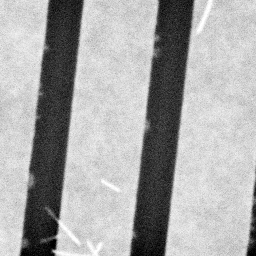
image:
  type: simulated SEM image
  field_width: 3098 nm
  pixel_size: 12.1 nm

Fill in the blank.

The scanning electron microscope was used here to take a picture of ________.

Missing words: lines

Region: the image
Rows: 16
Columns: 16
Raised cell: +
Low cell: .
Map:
+++..+++++..++++
+++..+++++..++++
+++..+++++..++++
+++..+++++..++++
+++..++++...++++
++...++++...++++
++...++++..+++++
++..+++++..+++++
++..+++++..+++++
++..+++++..+++++
++..+++++..+++++
++..+++++..+++++
++..++++...+++++
+...++++...+++++
+...++++...+++++
+...++++..+++++.